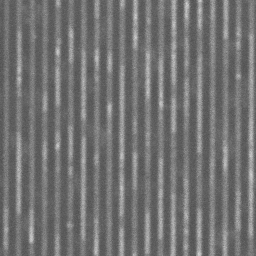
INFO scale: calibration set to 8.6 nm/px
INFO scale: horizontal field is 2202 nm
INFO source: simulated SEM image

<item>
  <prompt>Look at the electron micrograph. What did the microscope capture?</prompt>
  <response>parallel lines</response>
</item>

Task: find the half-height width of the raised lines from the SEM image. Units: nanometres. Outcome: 32.2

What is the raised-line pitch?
12.9 pixels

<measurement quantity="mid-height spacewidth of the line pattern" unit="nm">82.8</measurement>